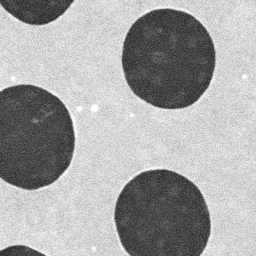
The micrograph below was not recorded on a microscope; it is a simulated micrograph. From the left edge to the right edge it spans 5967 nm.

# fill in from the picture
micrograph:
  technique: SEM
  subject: holes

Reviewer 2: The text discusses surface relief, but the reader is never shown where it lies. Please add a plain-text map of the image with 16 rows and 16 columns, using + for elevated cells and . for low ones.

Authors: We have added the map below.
....++++++++++++
++.+++++.....+++
++++++++.....+++
++++++++.....+++
++++++++.....+++
...+++++.....+++
....+++++...++++
.....+++++++++++
.....+++++++++++
.....+++++++++++
....++++++++++++
+..+++++....++++
+++++++......+++
+++++++......+++
+++++++......+++
..++++++.....+++